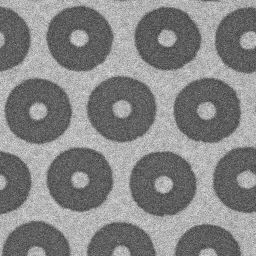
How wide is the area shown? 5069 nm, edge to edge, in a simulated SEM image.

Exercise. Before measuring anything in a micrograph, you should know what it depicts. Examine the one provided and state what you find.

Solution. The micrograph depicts ring-shaped grooves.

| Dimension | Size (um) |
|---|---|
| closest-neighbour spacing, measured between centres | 1.63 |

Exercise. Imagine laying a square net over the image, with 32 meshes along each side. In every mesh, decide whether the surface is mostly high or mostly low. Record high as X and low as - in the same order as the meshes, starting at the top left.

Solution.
XXXXXXXXXXXXXXXXXXXXXXXXXXXXXXXX
--XXXXX-----XXXXXXX----XXXXXX---
---XXX-------XXXXX------XXXX----
----XX--------XXX--------XX-----
----XX---XX---XXX---XX---XX---XX
----XX---XX---XXX---XX---XX---XX
---XXX--------XXX--------XX-----
---XXXX------XXXXX------XXXX----
--XXXXXX----XXXXXXX----XXXXXX---
XXXXXXXXXXXXXXXXXXXXXXXXXXXXXXXX
XX-----XXXXX------XXXXX------XXX
X-------XXX--------XXX-------XXX
X--------XX--------XXX--------XX
X---XX---XX---XX----XX---XX---XX
X---XX---XX----X---XXX---XX---XX
X--------XX--------XXX--------XX
XX------XXXX------XXXXX------XXX
XXX----XXXXXXX---XXXXXXX----XXXX
XXXXXXXXX--XXXXXXXXXXXXXXXXXX---
--XXXXX------XXXXX-----XXXXX----
---XXX--------XXX-------XXX-----
----XX--------XX--------XXX---X-
X---XX---XX---XX----X---XXX---XX
----XX--------XX---XX----XX-----
----XXX-------XX--------XXX-----
---XXXX------XXXX-------XXXX----
-XXXXXXXXXXXXXXXXX----XXXXXXXX--
XXXXXXXXXXXXXXXXXXXXXXXXXXXXXXXX
XX-----XXXXXX-----XXXXXX----XXXX
X-------XXXX-------XXXX------XXX
---------XX--------XXX--------XX
----XX---XX---XX---XXX---XX---XX